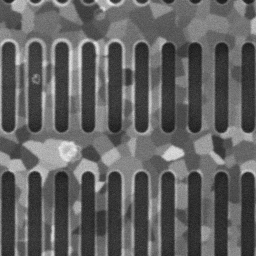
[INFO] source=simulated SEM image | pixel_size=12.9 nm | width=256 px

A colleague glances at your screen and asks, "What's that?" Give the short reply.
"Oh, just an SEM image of groups of lines, slits or small figures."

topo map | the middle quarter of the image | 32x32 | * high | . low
..**....***....**.....**....***.
..**....***....**.....**....***.
..**....***....**.....**....***.
..**....***....**.....**....***.
..**....***....**.....**....***.
..**....***....**.....**....***.
..**....***....**.....**....***.
..**....***....**.....**....***.
..**....***....**.....**....***.
.***....***....**.....**....***.
.***....***....**.....**....***.
.***....***....**.....**....***.
.***....***....**.....**....***.
.***....***....**.....**....***.
.***....***....**.....**....***.
.***....***....***...***....***.
.****...***...****...***....***.
********************************
********************************
********************************
********************************
********************************
********************************
********************************
********************************
********************************
********************************
.****...***...****...***...****.
.***....***....**....***....***.
.***....***....**.....**....***.
.***....***....**.....**....***.
.***....***....**.....**....***.